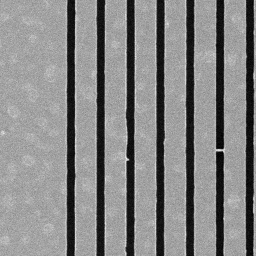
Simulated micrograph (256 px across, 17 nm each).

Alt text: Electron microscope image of parallel lines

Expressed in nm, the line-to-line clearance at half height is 145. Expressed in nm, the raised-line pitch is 509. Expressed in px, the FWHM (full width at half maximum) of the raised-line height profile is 21.4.